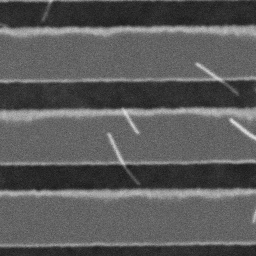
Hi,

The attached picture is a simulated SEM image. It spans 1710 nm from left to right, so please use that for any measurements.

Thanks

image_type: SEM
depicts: lines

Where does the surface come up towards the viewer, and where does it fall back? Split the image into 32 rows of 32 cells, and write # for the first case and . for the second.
................................
................................
................................
#....##.########################
################################
################################
################################
################################
################################
################################
................................
................................
................................
................................
################################
################################
################################
################################
################################
################################
############.#.#................
................................
................................
................................
################################
################################
################################
################################
################################
################################
########################.#..#...
................................